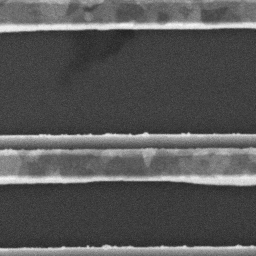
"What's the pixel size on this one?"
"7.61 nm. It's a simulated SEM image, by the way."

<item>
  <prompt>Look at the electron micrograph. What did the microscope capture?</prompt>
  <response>lines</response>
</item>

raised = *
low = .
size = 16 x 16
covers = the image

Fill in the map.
****************
****************
................
................
................
................
................
................
****************
****************
****************
................
................
................
................
.***************